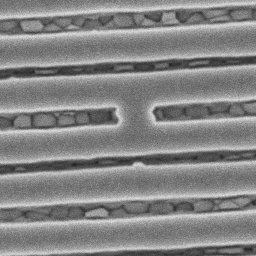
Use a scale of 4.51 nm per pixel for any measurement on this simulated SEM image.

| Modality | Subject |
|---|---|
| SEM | parallel lines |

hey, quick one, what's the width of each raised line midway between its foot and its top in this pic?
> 148 nm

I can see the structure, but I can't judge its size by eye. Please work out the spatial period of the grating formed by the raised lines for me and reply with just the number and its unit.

212 nm